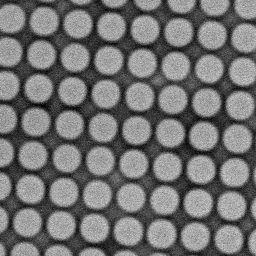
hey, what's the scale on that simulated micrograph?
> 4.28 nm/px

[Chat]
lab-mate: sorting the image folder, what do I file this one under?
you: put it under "an array of small figures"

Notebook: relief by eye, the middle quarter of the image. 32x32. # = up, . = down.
######..######..#######..######.
.###.....#####...######..######.
.................#####...######.
.##.......................####..
#####....###....................
#####...#####....####...........
#####..#######..######...#####..
#####..#######..######..######..
#####..#######.#######..#######.
####....#####...######..#######.
.........###....#####...######..
..................##.....#####..
###.............................
####...#####.....###............
#####..######..######....###....
#####.#######..######...#####...
#####.#######..#######.#######..
####...######..#######.#######..
##......####...######..#######..
................####....#####...
##.......................###....
###....####.....................
####..######...#####.....##.....
####..######..#######..######...
####..######..#######..######..#
####..######..#######..######..#
###...######..#######..######..#
........###....#####...######..#
........................####....
##.....###......................
###...#####....####.............
###..#######..######...####.....